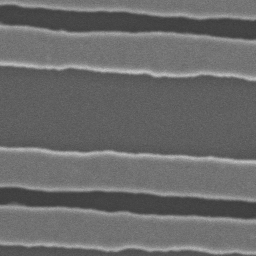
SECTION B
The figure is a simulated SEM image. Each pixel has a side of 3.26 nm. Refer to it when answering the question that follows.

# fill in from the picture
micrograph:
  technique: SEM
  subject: lines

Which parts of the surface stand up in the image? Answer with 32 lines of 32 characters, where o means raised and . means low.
oooooooooooooooooooooooooooooooo
................oooooooooooooooo
................................
ooooo...........................
oooooooooooooooooooooooooo......
oooooooooooooooooooooooooooooooo
oooooooooooooooooooooooooooooooo
oooooooooooooooooooooooooooooooo
....oooooooooooooooooooooooooooo
...................o.ooo.....ooo
................................
................................
................................
................................
................................
................................
................................
................................
................................
ooooooooooooooooooooo.o.........
oooooooooooooooooooooooooooooooo
oooooooooooooooooooooooooooooooo
oooooooooooooooooooooooooooooooo
...ooooooooooooooooooooooooooooo
......................oooooooooo
................................
oooooooooooooooo................
oooooooooooooooooooooooooooooooo
oooooooooooooooooooooooooooooooo
oooooooooooooooooooooooooooooooo
oooooooooooooooooooooooooooooooo
..........................oooooo